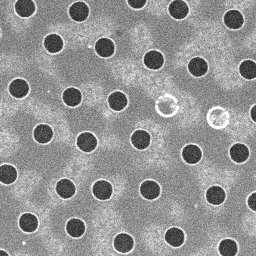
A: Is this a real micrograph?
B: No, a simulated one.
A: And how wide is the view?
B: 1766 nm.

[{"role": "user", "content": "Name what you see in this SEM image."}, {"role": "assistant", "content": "a regular array of holes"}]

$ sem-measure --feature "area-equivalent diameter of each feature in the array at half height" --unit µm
0.138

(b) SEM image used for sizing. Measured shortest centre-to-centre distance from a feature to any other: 44.8 px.